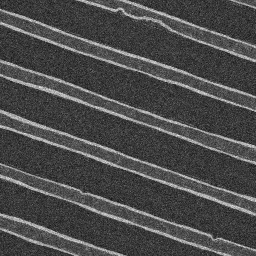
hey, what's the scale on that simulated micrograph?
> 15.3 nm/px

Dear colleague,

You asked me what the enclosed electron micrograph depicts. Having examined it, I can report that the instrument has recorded parallel lines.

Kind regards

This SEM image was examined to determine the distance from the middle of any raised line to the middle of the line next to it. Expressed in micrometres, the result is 0.744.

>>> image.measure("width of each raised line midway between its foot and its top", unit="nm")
196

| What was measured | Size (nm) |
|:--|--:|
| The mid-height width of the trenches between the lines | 546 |